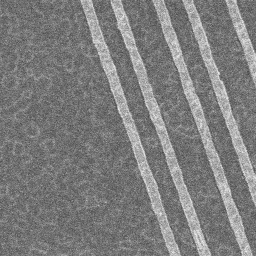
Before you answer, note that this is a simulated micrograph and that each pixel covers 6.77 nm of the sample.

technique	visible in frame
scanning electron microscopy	parallel lines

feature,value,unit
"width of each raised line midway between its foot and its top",0.063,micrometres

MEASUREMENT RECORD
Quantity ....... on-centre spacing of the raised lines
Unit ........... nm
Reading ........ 227